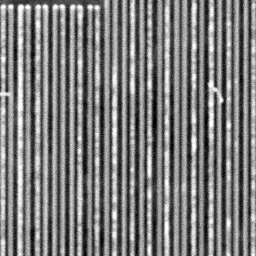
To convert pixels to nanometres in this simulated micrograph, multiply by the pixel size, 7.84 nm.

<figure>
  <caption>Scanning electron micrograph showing parallel lines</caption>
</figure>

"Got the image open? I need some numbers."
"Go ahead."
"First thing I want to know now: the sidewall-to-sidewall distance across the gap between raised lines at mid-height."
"43.1 nm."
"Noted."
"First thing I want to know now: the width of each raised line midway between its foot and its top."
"35.3 nm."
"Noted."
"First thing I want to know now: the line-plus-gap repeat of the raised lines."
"67.7 nanometres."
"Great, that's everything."